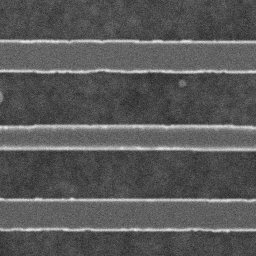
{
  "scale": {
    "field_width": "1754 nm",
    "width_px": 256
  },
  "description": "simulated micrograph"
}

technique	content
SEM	lines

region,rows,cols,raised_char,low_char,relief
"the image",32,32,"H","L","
LLLLLLLLLLLLLLLLLLLLLLLLLLLLLLLL
LLLLLLLLLLLLLLLLLLLLLLLLLLLLLLLL
LLLLLLLLLLLLLLLLLLLLLLLLLLLLLLLL
LLLLLLLLLLLLLLLLLLLLLLLLLLLLLLLL
LLLLLLLLLLLLLLLLLLLLLLLLLLLLLLLL
HHHHHHHHHHHHHHHHHHHHHHHHHHHHHHHH
HHHHHHHHHHHHHHHHHHHHHHHHHHHHHHHH
HHHHHHHHHHHHHHHHHHHHHHHHHHHHHHHH
HHHHHHHHHHHHHHHHHHHHHHHHHHHHHHHH
LLLLLLLLLLLLLLLLLLLLLLLLLLLLLLLL
LLLLLLLLLLLLLLLLLLLLLLLLLLLLLLLL
LLLLLLLLLLLLLLLLLLLLLLLLLLLLLLLL
LLLLLLLLLLLLLLLLLLLLLLLLLLLLLLLL
LLLLLLLLLLLLLLLLLLLLLLLLLLLLLLLL
LLLLLLLLLLLLLLLLLLLLLLLLLLLLLLLL
LLLLLLLLLLLLLLLLLLLLLLLLLLLLLLLL
HHHHHHHHHHHHHHHHHHHHHHHHHHHHHHHH
HHHHHHHHHHHHHHHHHHHHHHHHHHHHHHHH
HHHHHHHHHHHHHHHHHHHHHHHHHHHHHHHH
LLLLLLLLLLLLLLLLLLLLLLLLLLLLLLLL
LLLLLLLLLLLLLLLLLLLLLLLLLLLLLLLL
LLLLLLLLLLLLLLLLLLLLLLLLLLLLLLLL
LLLLLLLLLLLLLLLLLLLLLLLLLLLLLLLL
LLLLLLLLLLLLLLLLLLLLLLLLLLLLLLLL
LLLLLLLLLLLLLLLLLLLLLLLLLLLLLLLL
HHHHHHHHHHHHHHHHHHHHHHHHHHHHHHHH
HHHHHHHHHHHHHHHHHHHHHHHHHHHHHHHH
HHHHHHHHHHHHHHHHHHHHHHHHHHHHHHHH
HHHHHHHHHHHHHHHHHHHHHHHHHHHHHHHH
LLLLLLLLLLLLLLLLLLLLLLLLLLLLLLLL
LLLLLLLLLLLLLLLLLLLLLLLLLLLLLLLL
LLLLLLLLLLLLLLLLLLLLLLLLLLLLLLLL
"